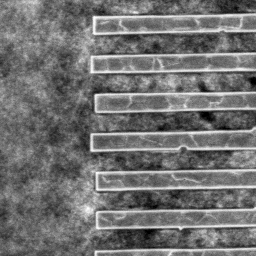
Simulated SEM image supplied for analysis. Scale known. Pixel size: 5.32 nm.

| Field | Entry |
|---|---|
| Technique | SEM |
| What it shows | parallel lines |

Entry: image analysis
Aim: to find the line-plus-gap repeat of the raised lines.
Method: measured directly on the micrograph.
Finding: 207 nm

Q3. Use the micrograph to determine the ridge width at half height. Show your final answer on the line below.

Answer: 93.7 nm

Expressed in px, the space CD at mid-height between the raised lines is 21.5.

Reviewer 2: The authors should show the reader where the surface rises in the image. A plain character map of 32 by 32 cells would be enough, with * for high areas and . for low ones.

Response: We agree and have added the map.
................................
................................
............********************
............********************
................................
................................
................................
...........*********************
...........*********************
................................
................................
................................
............********************
............********************
................................
................................
...........................*****
...........*********************
...........*********************
................................
................................
.............***....************
............********************
............*************.......
................................
................................
.............*******************
............********************
............**..***...*.........
................................
................................
............********************